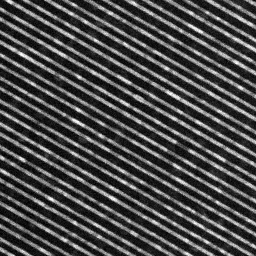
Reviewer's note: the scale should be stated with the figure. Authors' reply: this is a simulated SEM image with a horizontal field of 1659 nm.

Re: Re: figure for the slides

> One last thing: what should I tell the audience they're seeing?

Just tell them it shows parallel lines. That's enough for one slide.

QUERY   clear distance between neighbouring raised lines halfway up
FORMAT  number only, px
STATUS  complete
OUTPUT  6.28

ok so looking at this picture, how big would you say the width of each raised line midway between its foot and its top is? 14.8 nanometers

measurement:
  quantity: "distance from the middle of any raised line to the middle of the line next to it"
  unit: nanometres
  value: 64.5